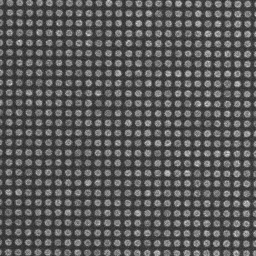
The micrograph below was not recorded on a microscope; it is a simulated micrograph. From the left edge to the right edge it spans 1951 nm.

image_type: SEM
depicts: a regular array of raised bodies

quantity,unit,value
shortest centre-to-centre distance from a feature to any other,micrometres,0.074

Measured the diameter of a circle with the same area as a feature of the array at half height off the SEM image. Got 47.1 nanometres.